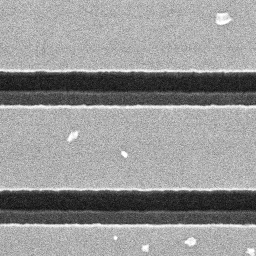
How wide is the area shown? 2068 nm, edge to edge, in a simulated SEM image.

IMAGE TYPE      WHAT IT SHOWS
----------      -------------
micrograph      lines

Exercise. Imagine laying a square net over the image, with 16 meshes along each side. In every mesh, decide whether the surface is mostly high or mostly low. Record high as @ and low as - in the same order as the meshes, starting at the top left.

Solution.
@@@@@@@@@@@@@@@@
@@@@@@@@@@@@@@@@
@@@@@@@@@@@@@@@@
@@@@@@@@@@@@@@@@
------------@-@-
----------------
----------------
@@@@@@@@@@@@@@@@
@@@@@@@@@@@@@@@@
@@@@@@@@@@@@@@@@
@@@@@@@@@@@@@@@@
@@@@@@@@@@@@@@@@
----------------
----------------
@@@@@@@@@@@@@@@@
@@@@@@@@@@@@@@@@